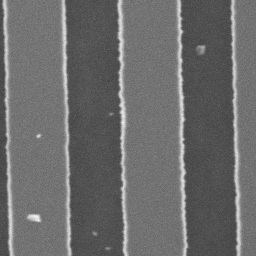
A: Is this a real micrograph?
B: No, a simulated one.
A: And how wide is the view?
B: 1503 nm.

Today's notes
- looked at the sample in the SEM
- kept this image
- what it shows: lines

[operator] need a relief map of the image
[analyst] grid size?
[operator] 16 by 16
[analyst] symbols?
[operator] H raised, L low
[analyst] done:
HHHHLLLHHHHLLLHH
HHHHLLLHHHHLLLHH
HHHHLLLHHHHLLLLH
HHHHLLLHHHHLLLLH
HHHHLLLHHHHLLLLH
HHHHLLLHHHHLLLLH
HHHHLLLLHHHLLLLH
HHHHLLLLHHHLLLLH
HHHHLLLLHHHLLLLH
HHHHLLLLHHHLLLLH
HHHHLLLLHHHHLLLH
HHHHLLLLHHHHLLLH
LHHHLLLLHHHHLLLH
LHHHLLLLHHHHLLLH
LHHHLLLLHHHHLLLH
LHHHLLLLHHHHLLLH